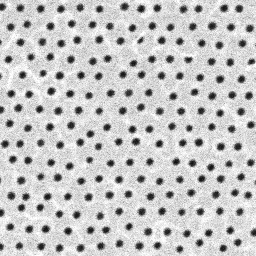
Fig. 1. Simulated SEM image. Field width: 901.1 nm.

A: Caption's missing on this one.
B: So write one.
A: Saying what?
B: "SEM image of a regular array of holes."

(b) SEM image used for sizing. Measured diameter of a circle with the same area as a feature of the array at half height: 28.1 nm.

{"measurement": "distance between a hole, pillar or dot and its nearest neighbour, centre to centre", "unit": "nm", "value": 60.2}